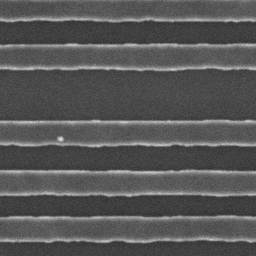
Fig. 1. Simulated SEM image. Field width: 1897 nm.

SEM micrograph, lines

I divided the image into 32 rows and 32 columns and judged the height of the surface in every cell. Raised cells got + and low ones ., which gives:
++++++++++++++++++++++++++++++++
++++++++++++++++++++++++++++++++
++++..++...+++++++.+++++++++++++
................................
................................
................................
++++++++++++++++++++++++++++++++
++++++++++++++++++++++++++++++++
++++++++++++++++++++++++++.+++++
................................
................................
................................
................................
................................
................................
++++++++++++++++++++++++++++++++
++++++++++++++++++++++++++++++++
++++++++++++++++++++++++++++++++
................................
................................
................................
++++++++++++++++++++++++++++++++
++++++++++++++++++++++++++++++++
++++++++++++++++++++++++++++++++
................................
................................
................................
++++++++++++++++++++++++++++++++
++++++++++++++++++++++++++++++++
++++++++++++++++++++++++++++++++
................................
................................